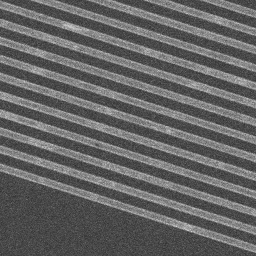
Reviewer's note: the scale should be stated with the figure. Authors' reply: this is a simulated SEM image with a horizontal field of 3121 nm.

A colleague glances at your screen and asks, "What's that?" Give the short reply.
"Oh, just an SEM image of parallel lines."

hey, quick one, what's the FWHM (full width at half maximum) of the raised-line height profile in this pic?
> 88.5 nanometres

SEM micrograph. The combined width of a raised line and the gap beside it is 210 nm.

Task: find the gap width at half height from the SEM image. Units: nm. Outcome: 123